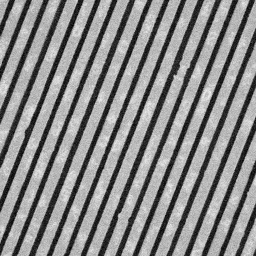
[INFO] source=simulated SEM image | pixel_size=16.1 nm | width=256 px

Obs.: parallel lines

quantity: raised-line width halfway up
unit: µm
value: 0.169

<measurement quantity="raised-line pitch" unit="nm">258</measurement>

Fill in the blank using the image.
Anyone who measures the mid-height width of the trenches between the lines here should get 5.23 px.